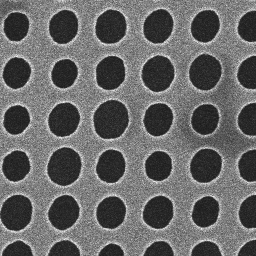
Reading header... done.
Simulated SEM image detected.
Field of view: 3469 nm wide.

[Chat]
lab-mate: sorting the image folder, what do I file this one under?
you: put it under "a regular array of holes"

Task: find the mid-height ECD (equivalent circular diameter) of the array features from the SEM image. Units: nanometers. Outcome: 430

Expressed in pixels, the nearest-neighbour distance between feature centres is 46.1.